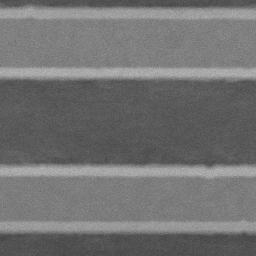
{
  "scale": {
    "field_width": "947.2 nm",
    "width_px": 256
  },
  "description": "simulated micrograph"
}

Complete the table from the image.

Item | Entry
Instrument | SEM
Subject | one or a few lines or trenches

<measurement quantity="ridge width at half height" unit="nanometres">212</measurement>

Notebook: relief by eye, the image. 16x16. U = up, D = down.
DDDDDDDDDDDDDDDD
UUUUUUUUUUUUUUUU
UUUUUUUUUUUUUUUU
UUUUUUUUUUUUUUUU
UUUUUUUUUUUUUUUU
DDDDDDDDDDDDDDDD
DDDDDDDDDDDDDDDD
DDDDDDDDDDDDDDDD
DDDDDDDDDDDDDDDD
DDDDDDDDDDDDDDDD
DDDDDDDDDDDDDDDD
UUUUUUUUUUUUUUUU
UUUUUUUUUUUUUUUU
UUUUUUUUUUUUUUUU
DDDDDDDDDDDDDDDD
DDDDDDDDDDDDDDDD